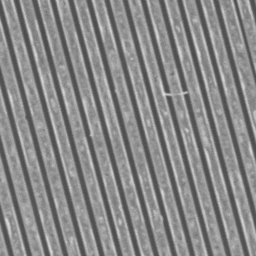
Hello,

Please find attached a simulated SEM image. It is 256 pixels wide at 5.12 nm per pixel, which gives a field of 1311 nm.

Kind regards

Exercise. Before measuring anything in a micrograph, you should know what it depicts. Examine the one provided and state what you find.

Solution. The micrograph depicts parallel lines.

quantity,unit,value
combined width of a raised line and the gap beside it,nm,89.9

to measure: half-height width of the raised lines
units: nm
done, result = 60.1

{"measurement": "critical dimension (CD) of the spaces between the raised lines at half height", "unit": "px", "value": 5.8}